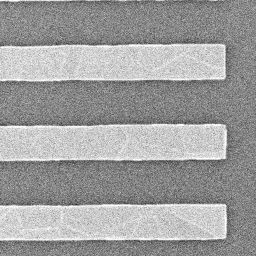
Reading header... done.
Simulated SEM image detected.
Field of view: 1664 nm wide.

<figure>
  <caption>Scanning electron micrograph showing wiring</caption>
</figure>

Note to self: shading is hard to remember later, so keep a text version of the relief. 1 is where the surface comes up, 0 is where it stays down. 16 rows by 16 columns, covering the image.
0000000000000000
0000000000000000
0000000000000000
1111111111111100
1111111111111100
0000000000000000
0000000000000000
0000000000000000
1111111111111100
1111111111111100
0000000000000000
0000000000000000
0000000000000000
1111111111111100
1111111111111100
0000000000000000